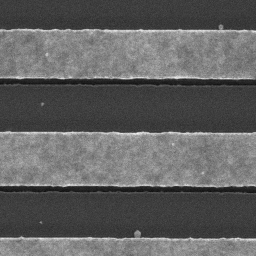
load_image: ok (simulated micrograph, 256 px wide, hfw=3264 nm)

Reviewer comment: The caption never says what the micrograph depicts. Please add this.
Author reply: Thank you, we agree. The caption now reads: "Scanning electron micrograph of lines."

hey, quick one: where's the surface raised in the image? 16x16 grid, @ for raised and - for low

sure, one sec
----------------
----------------
@@@@@@@@@@@@@@@@
@@@@@@@@@@@@@@@@
@@@@@@@@@@@@@@@@
----------------
----------------
----------------
@@@@@@@@@@@@@@@@
@@@@@@@@@@@@@@@@
@@@@@@@@@@@@@@@@
@@@@@@@@@@@@@@@@
----------------
----------------
----------------
@@@@@@@@@@@@@@@@